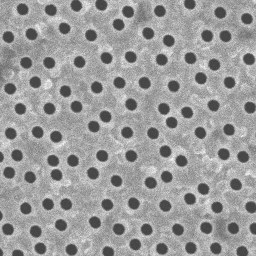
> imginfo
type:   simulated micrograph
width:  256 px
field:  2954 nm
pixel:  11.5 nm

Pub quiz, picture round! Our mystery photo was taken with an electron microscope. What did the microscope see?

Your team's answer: a regular array of holes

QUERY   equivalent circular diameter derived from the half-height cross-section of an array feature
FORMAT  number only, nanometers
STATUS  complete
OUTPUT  140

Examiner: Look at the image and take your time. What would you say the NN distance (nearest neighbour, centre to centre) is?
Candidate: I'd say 251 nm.